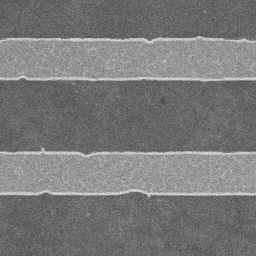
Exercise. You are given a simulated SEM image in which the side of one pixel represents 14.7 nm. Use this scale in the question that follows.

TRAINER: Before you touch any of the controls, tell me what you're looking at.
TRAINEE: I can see one or a few lines or trenches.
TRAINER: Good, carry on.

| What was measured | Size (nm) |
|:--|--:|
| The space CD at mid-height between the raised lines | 1090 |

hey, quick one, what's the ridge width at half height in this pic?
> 589 nanometres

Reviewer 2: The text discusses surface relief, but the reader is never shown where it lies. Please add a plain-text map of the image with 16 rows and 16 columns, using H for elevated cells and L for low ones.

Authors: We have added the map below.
LLLLLLLLLLLLLLLL
LLLLLLLLLLLLLLLL
HHHHLLLLLLLHHLLL
HHHHHHHHHHHHHHHH
HHHHHHHHHHHHHHHH
LLLLLLLLLLLLLLLL
LLLLLLLLLLLLLLLL
LLLLLLLLLLLLLLLL
LLLLLLLLLLLLLLLL
LLLLLLLLLLLLLLLL
HHHHHHHHHHHHHHHH
HHHHHHHHHHHHHHHH
LLLLLLLLLLLLLLLL
LLLLLLLLLLLLLLLL
LLLLLLLLLLLLLLLL
LLLLLLLLLLLLLLLL